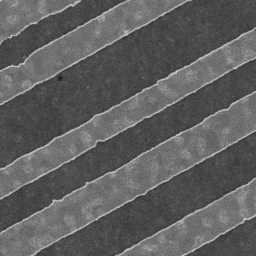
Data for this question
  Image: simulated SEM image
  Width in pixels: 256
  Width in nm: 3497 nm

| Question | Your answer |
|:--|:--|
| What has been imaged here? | one or a few lines or trenches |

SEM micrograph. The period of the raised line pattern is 950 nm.